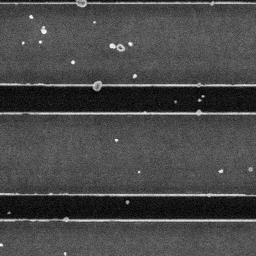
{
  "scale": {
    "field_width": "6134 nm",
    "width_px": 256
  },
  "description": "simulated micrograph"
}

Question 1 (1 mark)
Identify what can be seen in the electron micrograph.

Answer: lines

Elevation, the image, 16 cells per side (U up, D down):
DDDDDDDDDDDDDDDD
DDDDDDDDDDDDDDDD
DDDDDDDDDDDDDDDD
DDDDDDDDDDDDDDDD
DDDDDDDDDDDDDDDD
UUUUUUUUUUUUUUUU
UUUUUUUUUUUUUUUU
DDDDDDDDDDDDDDDD
DDDDDDDDDDDDDDDD
DDDDDDDDDDDDDDDD
DDDDDDDDDDDDDDDD
DDDDDDDDDDDDDDDD
UUUUUUUUUUUUUUUU
UUUUUUUUUUUUUUUU
DDDDDDDDDDDDDDDD
DDDDDDDDDDDDDDDD